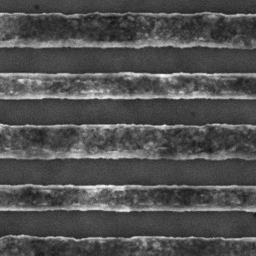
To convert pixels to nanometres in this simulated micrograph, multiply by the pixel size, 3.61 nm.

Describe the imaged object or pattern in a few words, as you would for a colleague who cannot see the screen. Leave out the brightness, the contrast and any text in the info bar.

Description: lines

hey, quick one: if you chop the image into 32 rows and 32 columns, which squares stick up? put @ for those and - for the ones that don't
--------------------------------
--------------------------------
@@@@@@@@@@@@@@@@@@@@@@@@@@@@@@@@
@@@@@@@@@@@@@@@@@@@@@@@@@@@@@@@@
@@@@@@@@@@@@@@@@@@@@@@@@@@@@@@@@
@@--@@@@-@@@@@@@@@----@@@@@@@--@
--------------------------------
--------------------------------
--------------------------------
@@@@@--@@@@@@@@@@@@@@@@@@@@@@@@@
@@@@@@@@@@@@@@@@@@@@@@@@@@@@@@@@
@@@@@@@@@@@@@@@@@@@@@@@@@@@@@@@@
--------------------------------
--------------------------------
--------------------------------
--------------------------------
@@@@@@@@@@@@@@@@@@@@@@@@@@@@@@@@
@@@@@@@@@@@@@@@@@@@@@@@@@@@@@@@@
@@@@@@@@@@@@@@@@@@@@@@@@@@@@@@@@
-----------@----------@@@@@@----
--------------------------------
--------------------------------
--------------------------------
@@@@@@@@@@@@@@@@@@@@@@@@@@@@@@@-
@@@@@@@@@@@@@@@@@@@@@@@@@@@@@@@@
@@@@@@@@@@@@@@@@@@@@@@@@@@@@@@@@
--------------------------------
--------------------------------
--------------------------------
--------------------------------
@@@@@@@@@@@@@@@@@@@@@@@@@@@@@@@@
@@@@@@@@@@@@@@@@@@@@@@@@@@@@@@@@